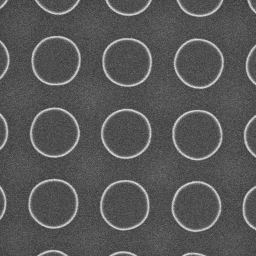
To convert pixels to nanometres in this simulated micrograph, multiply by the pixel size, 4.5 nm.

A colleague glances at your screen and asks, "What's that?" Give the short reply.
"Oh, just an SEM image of an array of small figures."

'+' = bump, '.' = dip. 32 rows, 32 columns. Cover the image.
+....+++++...++++++...++++++...+
......++......++++.....++++.....
................................
................................
................................
.....++++.....++++.....++++.....
+...++++++...++++++...++++++...+
+...++++++...++++++...++++++...+
+...++++++...++++++...++++++...+
.....++++....+++++....+++++....+
......++.......++......++++.....
................................
................................
................................
.....++++.....++++.....++++.....
+...++++++...++++++...+++++....+
+...++++++...++++++...++++++...+
+...++++++...++++++...++++++...+
....+++++....+++++....+++++....+
......++......+++......+++......
................................
................................
......+.........................
....+++++....+++++.....++++.....
+...++++++...+++++....+++++....+
+...++++++...++++++...++++++..++
+...++++++...++++++...++++++..++
....+++++....+++++....+++++....+
..............+++......+++......
................................
................................
......++.......+................